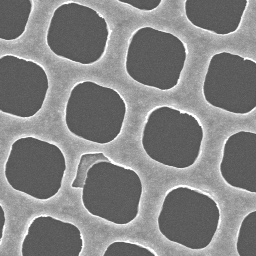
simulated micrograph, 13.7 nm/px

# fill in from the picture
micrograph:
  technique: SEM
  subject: holes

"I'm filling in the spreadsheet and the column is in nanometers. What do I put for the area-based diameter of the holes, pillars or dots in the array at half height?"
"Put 832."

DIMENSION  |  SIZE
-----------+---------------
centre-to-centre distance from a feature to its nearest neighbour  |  1110 nm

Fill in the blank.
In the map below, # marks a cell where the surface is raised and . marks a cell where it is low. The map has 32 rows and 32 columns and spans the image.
....####..######....###........#
....###.....###########.......##
...###.......###########......##
...###.......#####.######.....##
..####........###.....##########
######.......###.......#########
#######......###.......#########
...######...####.......###.....#
.....###########.......###......
......##########......####......
......####..######....###.......
......###......##########.......
......###......###########......
.....###........####.######.....
##..####........###.....########
########.......###.......#######
#########......###.......#####.#
##...######...####.......###....
#......###########.......###....
#.......###########......###....
#.......####..######....####....
#.......###......###########....
#.......###.......##########....
##......##........####..######..
####...###........###.....######
##########.......###.......#####
###########......###.......#####
.###...######....###.......###..
####......##########.......###..
###.......###########......###..
###.......####...######...####..
###.......###......###########..